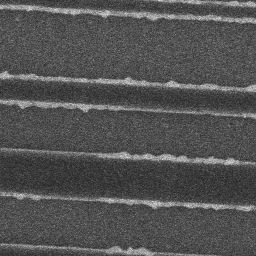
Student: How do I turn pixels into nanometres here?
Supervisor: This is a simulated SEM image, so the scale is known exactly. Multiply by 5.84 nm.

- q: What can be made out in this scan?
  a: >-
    one or a few lines or trenches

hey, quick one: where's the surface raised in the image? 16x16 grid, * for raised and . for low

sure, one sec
****************
................
................
................
................
****************
****************
................
................
****............
****************
****************
.....***********
................
................
****............